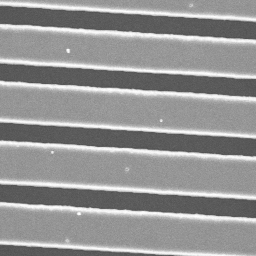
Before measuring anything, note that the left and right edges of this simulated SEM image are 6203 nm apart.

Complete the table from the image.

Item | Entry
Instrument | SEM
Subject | lines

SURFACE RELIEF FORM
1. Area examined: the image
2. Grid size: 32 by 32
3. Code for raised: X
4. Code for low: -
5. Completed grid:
XXXXXXXXXXXXXXXXXXXXXXXXXXXXXXXX
---------------XXXXXXXXXXXXXXXXX
-------------------------------X
XXXXXXX-------------------------
XXXXXXXXXXXXXXXXXXXXXXX---------
XXXXXXXXXXXXXXXXXXXXXXXXXXXXXXXX
XXXXXXXXXXXXXXXXXXXXXXXXXXXXXXXX
XXXXXXXXXXXXXXXXXXXXXXXXXXXXXXXX
-----------XXXXXXXXXXXXXXXXXXXXX
---------------------------XXXXX
XXXXX---------------------------
XXXXXXXXXXXXXXXXXXXXXX----------
XXXXXXXXXXXXXXXXXXXXXXXXXXXXXXXX
XXXXXXXXXXXXXXXXXXXXXXXXXXXXXXXX
XXXXXXXXXXXXXXXXXXXXXXXXXXXXXXXX
----XXXXXXXXXXXXXXXXXXXXXXXXXXXX
--------------------XXXXXXXXXXXX
--------------------------------
XXXXXXXXXXXXXX------------------
XXXXXXXXXXXXXXXXXXXXXXXXXXXXXX--
XXXXXXXXXXXXXXXXXXXXXXXXXXXXXXXX
XXXXXXXXXXXXXXXXXXXXXXXXXXXXXXXX
XXXXXXXXXXXXXXXXXXXXXXXXXXXXXXXX
-----------XXXXXXXXXXXXXXXXXXXXX
-------------------------XXXXXXX
XX------------------------------
XXXXXXXXXXXXXXXXXXX-------------
XXXXXXXXXXXXXXXXXXXXXXXXXXXXXXXX
XXXXXXXXXXXXXXXXXXXXXXXXXXXXXXXX
XXXXXXXXXXXXXXXXXXXXXXXXXXXXXXXX
XXXXXXXXXXXXXXXXXXXXXXXXXXXXXXXX
-----------------XXXXXXXXXXXXXXX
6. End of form